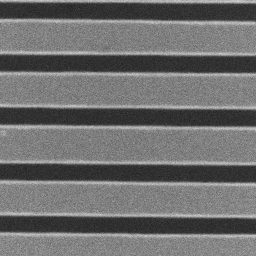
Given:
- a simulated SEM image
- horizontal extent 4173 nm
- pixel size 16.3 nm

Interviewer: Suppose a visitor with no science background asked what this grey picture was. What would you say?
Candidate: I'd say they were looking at lines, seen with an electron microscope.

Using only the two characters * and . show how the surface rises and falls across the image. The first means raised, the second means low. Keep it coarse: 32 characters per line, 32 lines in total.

................................
................................
*********.*.....................
********************************
********************************
********************************
********************************
................................
................................
********************************
********************************
********************************
********************************
....................************
................................
................................
********************************
********************************
********************************
********************************
......................**********
................................
................................
********************************
********************************
********************************
********************************
................................
................................
********************************
********************************
********************************